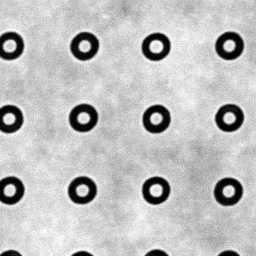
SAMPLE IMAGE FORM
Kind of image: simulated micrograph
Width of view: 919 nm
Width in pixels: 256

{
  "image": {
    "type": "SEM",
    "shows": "a regular array of ring-shaped grooves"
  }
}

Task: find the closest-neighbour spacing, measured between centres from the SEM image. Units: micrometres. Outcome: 0.257